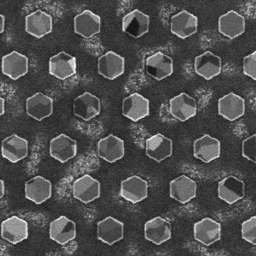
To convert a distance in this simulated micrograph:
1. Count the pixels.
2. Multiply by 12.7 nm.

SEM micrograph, a regular array of raised bodies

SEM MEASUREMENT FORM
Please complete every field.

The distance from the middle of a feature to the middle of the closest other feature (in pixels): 47.3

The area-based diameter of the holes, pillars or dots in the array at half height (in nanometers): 329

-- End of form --